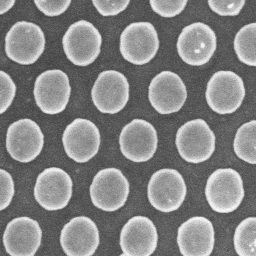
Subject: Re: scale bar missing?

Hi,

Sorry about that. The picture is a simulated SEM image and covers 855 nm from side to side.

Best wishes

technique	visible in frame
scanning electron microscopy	a regular array of raised bodies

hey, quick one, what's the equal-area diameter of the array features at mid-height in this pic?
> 39 px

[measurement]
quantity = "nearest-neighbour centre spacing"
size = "0.187 µm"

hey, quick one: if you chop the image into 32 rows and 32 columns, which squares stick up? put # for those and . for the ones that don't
##...###....####...####...####..
.....###.....##.....##.....###..
................................
..###....###....###....###....##
.####...####...#####...####...##
.####...#####..#####..#####..###
.####...####...####...#####...##
..##.....###....##.....###....##
................................
#....###.....##.....##.....###..
##..#####...####...####...####..
##..#####...####...####...####..
#....###....####...####...####..
#....###....###....####....###..
................................
..##.....###....###....###.....#
.####...####...####...####....##
.####...####...#####..#####..###
.####...####...####...#####..###
..##.....###....###....###....##
................................
#....###.....##.....##.....##...
#....####...####...####...####..
##..#####..#####...####...####..
##..#####..#####...####...####..
#....###....###....###....####..
................................
..##.....##.....##......##.....#
.####...####...####....####...##
#####...####...#####..#####..###
.####...####...####...#####..###
.###....####....###....###....##